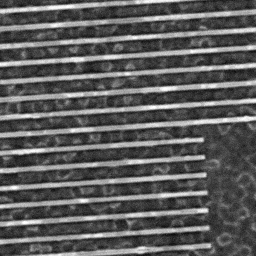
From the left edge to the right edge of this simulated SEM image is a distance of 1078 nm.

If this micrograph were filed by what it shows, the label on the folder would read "parallel lines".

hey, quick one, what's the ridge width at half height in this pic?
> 0.0147 micrometres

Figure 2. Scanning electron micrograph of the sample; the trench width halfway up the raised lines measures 58.8 nm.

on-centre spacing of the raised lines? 74.6 nanometres